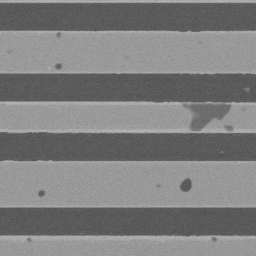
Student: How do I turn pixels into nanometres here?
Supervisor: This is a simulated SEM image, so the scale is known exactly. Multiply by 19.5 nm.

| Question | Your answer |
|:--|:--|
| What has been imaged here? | lines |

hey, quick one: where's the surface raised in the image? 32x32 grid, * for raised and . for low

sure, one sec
................................
................................
................................
................................
********************************
********************************
********************************
********************************
********************************
................................
................................
................................
................................
********************************
********************************
********************************
................................
................................
................................
................................
********************************
********************************
********************************
********************************
********************************
********************************
................................
................................
................................
................................
********************************
********************************